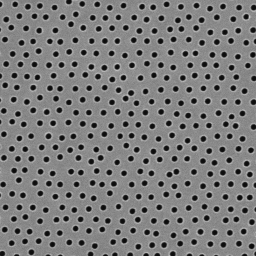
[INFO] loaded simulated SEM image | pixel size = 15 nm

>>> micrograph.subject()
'a regular array of holes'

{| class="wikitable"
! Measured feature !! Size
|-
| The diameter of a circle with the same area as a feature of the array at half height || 0.0881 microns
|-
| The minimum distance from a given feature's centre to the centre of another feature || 175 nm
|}